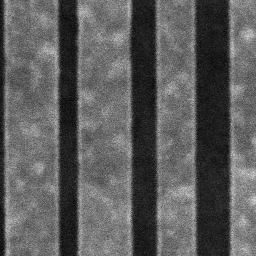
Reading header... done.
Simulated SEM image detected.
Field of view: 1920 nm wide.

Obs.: one or a few lines or trenches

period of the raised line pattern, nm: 542